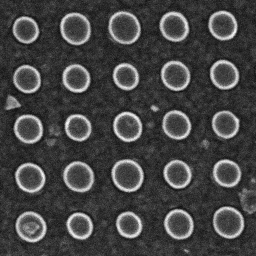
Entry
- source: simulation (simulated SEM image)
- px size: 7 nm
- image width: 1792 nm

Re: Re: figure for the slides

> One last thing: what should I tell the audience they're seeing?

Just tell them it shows a regular array of raised bodies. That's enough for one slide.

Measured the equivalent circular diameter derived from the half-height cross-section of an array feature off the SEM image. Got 191 nm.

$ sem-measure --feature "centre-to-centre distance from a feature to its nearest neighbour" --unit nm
343